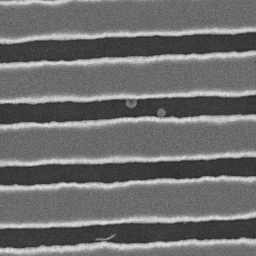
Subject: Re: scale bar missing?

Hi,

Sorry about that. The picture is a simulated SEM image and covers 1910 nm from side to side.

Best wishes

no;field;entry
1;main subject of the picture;lines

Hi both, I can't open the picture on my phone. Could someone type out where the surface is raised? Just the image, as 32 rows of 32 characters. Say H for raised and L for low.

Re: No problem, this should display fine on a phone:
HHHHHHHHHHHHHHHHHHHHHHHHHHHHHHHH
HHHHHHHHHHHHHHHHHHHHHHHHHHHHHHHH
HHHHHHHHHHHHHHHHHHHHHHHHHHHHHHHH
HHHHHHHHHHHHHHHHHHHHHHHHHHHHHHHH
HHHHHHHHHHHHHHHLLLLLLLLLLLLLLLLL
LLLLLLLLLLLLLLLLLLLLLLLLLLLLLLLL
LLLLLLLLLLLLLLLLLLLLLLLLLLLLLLLH
LLLLLLLLLLHHHHHHHHHHHHHHHHHHHHHH
HHHHHHHHHHHHHHHHHHHHHHHHHHHHHHHH
HHHHHHHHHHHHHHHHHHHHHHHHHHHHHHHH
HHHHHHHHHHHHHHHHHHHHHHHHHHHHHHHH
HHHHHHHHHHHHHHHHHHHHHHHHHHHHHHHH
HHHHHHHHHHHHLLLLLLLLLLLLLLLLLLLL
LLLLLLLLLLLLLLLLLLLLLLLLLLLLLLLL
LLLLLLLLLLLLLLLLLLLLLLLLLLLLLHHH
LHHHHHHHHHHHHHHHHHHHHHHHHHHHHHHH
HHHHHHHHHHHHHHHHHHHHHHHHHHHHHHHH
HHHHHHHHHHHHHHHHHHHHHHHHHHHHHHHH
HHHHHHHHHHHHHHHHHHHHHHHHHHHHHHHH
HHHHHHHHHHHHHHHHHHHHHHHHHHHHHHHH
HHHHHHLLLLLLLLLLLLLLLLLLLLLLLLLL
LLLLLLLLLLLLLLLLLLLLLLLLLLLLLLLL
LLLLLLLLLLLLLLLLLLLHHHHHHHHHHHHH
HHHHHHHHHHHHHHHHHHHHHHHHHHHHHHHH
HHHHHHHHHHHHHHHHHHHHHHHHHHHHHHHH
HHHHHHHHHHHHHHHHHHHHHHHHHHHHHHHH
HHHHHHHHHHHHHHHHHHHHHHHHHHHHHHHH
HHHHHHHHHHHHHHHHHHHHHHHHHHLLLLLL
LLLLLLLLLLLLLLLLLLLLLLLLLLLLLLLL
LLLLLLLLLLLLLLLLLLLLLLLLLLLLLLLL
LLLLLLLLLLLHHHHLHLHHHHHHHHHHHHHH
HHHHHHHHHHHHHHHHHHHHHHHHHHHHHHHH